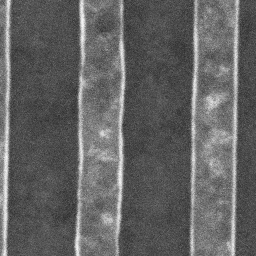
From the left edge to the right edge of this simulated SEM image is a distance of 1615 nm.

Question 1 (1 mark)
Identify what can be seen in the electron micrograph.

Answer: one or a few lines or trenches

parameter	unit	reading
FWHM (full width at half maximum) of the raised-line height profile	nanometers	256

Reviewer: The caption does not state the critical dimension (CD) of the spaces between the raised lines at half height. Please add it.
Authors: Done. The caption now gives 460 nm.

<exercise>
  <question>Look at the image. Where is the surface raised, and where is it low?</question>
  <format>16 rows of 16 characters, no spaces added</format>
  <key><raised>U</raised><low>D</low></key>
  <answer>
UDDDDUUUDDDDUUUD
UDDDDUUUDDDDUUUD
DDDDDUUUDDDDUUUD
UDDDDUUUDDDDUUUD
UDDDDUUUDDDDUUUD
DDDDDUUUDDDDUUUD
DDDDDUUUDDDDUUUD
DDDDDUUUDDDDUUUD
DDDDDUUDDDDDUUUD
DDDDDUUUDDDDUUUD
DDDDDUUUDDDDUUUD
DDDDDUUDDDDDUUUD
DDDDDUUDDDDDUUUD
DDDDDUUDDDDDUUUD
DDDDDUUDDDDDUUUD
DDDDDUUDDDDDUUUD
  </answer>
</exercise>